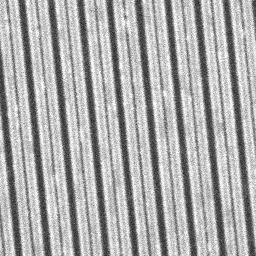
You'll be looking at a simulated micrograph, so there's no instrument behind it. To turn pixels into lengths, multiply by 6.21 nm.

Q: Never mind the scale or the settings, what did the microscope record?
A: parallel lines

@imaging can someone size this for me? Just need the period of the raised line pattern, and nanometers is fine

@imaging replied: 89.8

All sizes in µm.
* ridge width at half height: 0.0509